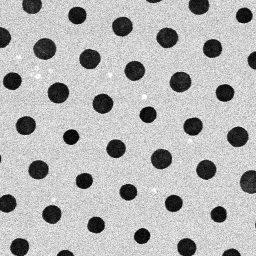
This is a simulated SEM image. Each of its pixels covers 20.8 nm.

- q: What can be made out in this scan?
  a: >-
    a regular array of holes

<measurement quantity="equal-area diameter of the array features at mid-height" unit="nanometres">401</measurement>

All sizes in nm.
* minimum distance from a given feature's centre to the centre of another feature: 950